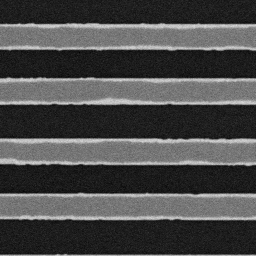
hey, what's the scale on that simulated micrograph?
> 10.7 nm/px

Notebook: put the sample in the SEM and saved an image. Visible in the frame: lines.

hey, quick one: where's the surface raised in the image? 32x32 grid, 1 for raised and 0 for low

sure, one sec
00000000000000000000000000000000
00000000000000000000000000000000
00000000000000000000000000000000
11111111111111111111111111111111
11111111111111111111111111111111
11111111111111111111111111111111
00000000000000000000000000000000
00000000000000000000000000000000
00000000000000000000000000000000
00000000000000000000000000000000
11111111111111111111111111111111
11111111111111111111111111111111
11111111111111111111111111111111
00000000000000000000000000000000
00000000000000000000000000000000
00000000000000000000000000000000
00000000000000000000000000000000
00000000000000100000000000000000
11111111111111111111111111111111
11111111111111111111111111111111
00000000000001010000000000111111
00000000000000000000000000000000
00000000000000000000000000000000
00000000000000000000000000000000
11111111111111111111111111111111
11111111111111111111111111111111
11111111111111111111111111111111
00000000000000000000000000000000
00000000000000000000000000000000
00000000000000000000000000000000
00000000000000000000000000000000
00000000000000000000000000000000